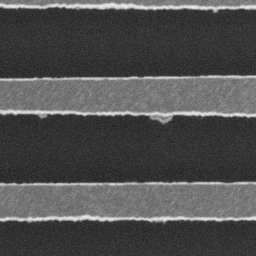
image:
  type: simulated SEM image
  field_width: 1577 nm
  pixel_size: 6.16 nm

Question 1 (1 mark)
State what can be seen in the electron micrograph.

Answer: lines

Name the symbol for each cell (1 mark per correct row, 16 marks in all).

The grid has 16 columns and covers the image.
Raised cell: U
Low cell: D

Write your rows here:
DDDDDDDDDUDDUUUD
DDDDDDDDDDDDDDDD
DDDDDDDDDDDDDDDD
DDDDDDDDDDDDDDDD
DDDDDDDDDDDDDDDD
UUUUUUUUUUUUUUUU
UUUUUUUUUUUUUUUU
DDDDDDDDDDDDDDDD
DDDDDDDDDDDDDDDD
DDDDDDDDDDDDDDDD
DDDDDDDDDDDDDDDD
UUUUUUUUUUUUUUUU
UUUUUUUUUUUUUUUU
UUUUUUUUUUUUUUUU
DDDDDDDDDDDDDDDD
DDDDDDDDDDDDDDDD